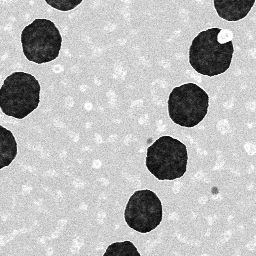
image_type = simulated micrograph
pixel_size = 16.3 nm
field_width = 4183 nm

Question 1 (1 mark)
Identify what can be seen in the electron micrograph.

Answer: holes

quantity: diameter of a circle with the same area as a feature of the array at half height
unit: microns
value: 0.695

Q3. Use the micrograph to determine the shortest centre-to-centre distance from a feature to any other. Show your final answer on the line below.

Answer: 57.6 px